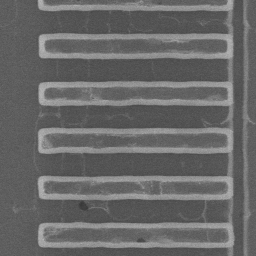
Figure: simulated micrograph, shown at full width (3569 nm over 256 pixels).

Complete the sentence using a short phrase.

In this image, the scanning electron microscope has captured wiring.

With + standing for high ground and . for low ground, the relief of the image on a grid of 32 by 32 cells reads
.....++++++++++++++++++++++++...
................................
................................
................................
................................
.....++++++++++++++++++++++++...
.....++++++++++++++++++++++++...
................................
................................
................................
................++..............
.....++++++++++++++++++++++++...
.....++++++++++++++++++++++++...
................................
................................
................................
.....+++++++++++++++++++++++....
.....++++++++++++++++++++++++...
.....++++++++++++++++++++++++...
................................
................................
................................
.....++++++++++++++++++++++++...
.....++++++++++++++++++++++++...
.....+++++++++++++++++++++++....
................................
................................
................................
.....++++++++++++++++++++++++...
.....++++++++++++++++++++++++...
.....++++++++++++++++++++++++...
................................